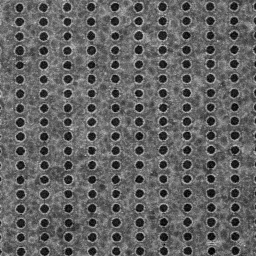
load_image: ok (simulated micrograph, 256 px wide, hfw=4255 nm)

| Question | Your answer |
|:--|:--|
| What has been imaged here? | a regular array of holes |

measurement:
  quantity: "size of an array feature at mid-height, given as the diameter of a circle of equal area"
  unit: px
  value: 9.51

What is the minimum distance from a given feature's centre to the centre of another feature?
14.2 px